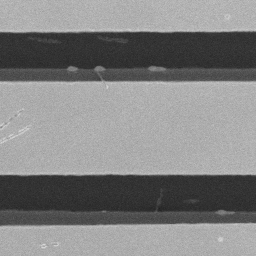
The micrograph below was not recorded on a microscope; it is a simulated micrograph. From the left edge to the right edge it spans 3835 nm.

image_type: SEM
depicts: lines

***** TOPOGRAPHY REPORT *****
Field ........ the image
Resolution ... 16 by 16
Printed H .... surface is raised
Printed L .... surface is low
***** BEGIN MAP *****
HHHHHHHHHHHHHHHH
HHHHHHHHHHHHHHHH
LLLLLLLLLLLLLLLL
LLLLLLLLLLLLLLLL
LLLLLLLLLLLLLLLL
HHHHHHHHHHHHHHHH
HHHHHHHHHHHHHHHH
HHHHHHHHHHHHHHHH
HHHHHHHHHHHHHHHH
HHHHHHHHHHHHHHHH
HHHHHHHHHHHHHHHH
LLLLLLLLLLLLLLLL
LLLLLLLLLLLLLLLL
LLLLLLLLLLLLLLLL
HHHHHHHHHHHHHHHH
HHHHHHHHHHHHHHHH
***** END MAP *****